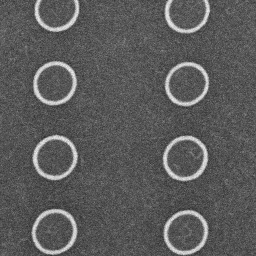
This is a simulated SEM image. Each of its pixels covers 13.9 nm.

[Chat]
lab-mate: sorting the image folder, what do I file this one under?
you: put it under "raised bodies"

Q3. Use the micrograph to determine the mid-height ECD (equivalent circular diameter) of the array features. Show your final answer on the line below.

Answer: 570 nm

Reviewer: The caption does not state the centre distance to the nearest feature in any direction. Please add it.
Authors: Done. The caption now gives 1.03 microns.